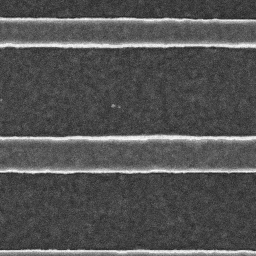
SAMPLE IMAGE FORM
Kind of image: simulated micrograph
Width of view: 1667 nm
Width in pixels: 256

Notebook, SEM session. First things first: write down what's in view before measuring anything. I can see lines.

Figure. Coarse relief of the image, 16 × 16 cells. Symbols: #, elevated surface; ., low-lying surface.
................
################
################
................
................
................
................
................
................
################
################
................
................
................
................
................